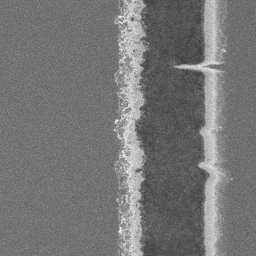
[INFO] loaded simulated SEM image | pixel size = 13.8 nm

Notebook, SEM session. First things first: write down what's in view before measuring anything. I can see one or a few lines or trenches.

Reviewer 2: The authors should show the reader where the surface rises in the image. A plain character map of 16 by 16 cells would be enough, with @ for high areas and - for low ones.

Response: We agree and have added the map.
@@@@@@@@-----@@@
@@@@@@@@-----@@@
@@@@@@@@-----@@@
@@@@@@@@-----@@@
@@@@@@@@@----@@@
@@@@@@@@-----@@@
@@@@@@@@-----@@@
@@@@@@@@-----@@@
@@@@@@@@-----@@@
@@@@@@@@-----@@@
@@@@@@@@-----@@@
@@@@@@@@-----@@@
@@@@@@@@-----@@@
@@@@@@@@-----@@@
@@@@@@@@-----@@@
@@@@@@@@@----@@@